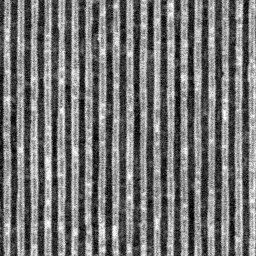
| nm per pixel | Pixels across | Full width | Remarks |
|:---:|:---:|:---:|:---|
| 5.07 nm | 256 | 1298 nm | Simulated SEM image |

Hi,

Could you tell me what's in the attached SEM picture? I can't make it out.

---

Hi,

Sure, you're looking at parallel lines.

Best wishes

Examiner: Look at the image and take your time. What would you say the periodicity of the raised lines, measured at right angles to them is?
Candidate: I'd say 69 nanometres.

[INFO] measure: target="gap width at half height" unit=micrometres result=0.0431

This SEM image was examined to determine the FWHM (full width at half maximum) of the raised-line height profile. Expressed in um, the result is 0.0291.